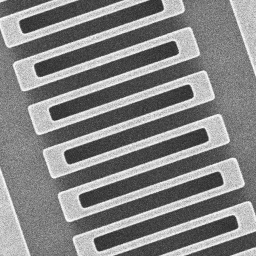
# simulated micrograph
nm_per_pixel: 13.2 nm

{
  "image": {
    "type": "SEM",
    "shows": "groups of lines, slits or small figures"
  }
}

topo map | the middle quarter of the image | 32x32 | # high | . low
...######...........######......
######...........#######........
###............######...........
............######............##
.........######............#####
......######............######..
...######............######.....
######............######........
###............######...........
...........######............###
.........######...........######
......######...........#######..
...######............######.....
######............######........
###............######...........
............######............##
.........######............#####
......######............######..
...######............######.....
######............######........
####...........######...........
#...........######............##
..........#####............#####
.......######...........######..
#...######...........#######....
#######............######.......
####............######..........
#............######............#
..........######............####
.......######............######.
....######............#####.....
.######...........######........